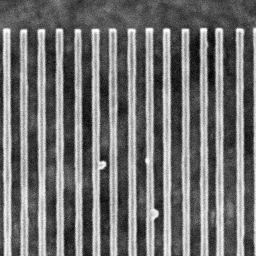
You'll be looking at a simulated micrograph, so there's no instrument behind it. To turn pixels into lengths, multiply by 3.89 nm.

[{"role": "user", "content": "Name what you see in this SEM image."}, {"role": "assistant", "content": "parallel lines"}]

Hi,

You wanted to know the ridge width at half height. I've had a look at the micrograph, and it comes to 25.8 nanometres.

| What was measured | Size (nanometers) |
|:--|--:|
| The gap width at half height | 44.3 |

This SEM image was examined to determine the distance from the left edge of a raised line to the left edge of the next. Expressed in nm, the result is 69.8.